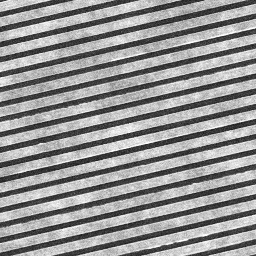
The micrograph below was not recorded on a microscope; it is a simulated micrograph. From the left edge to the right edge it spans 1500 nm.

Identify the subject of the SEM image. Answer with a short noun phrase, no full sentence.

parallel lines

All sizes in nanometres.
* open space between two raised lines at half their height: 34.3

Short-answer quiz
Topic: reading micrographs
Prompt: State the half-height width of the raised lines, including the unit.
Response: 51.5 nm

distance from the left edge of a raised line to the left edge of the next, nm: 86